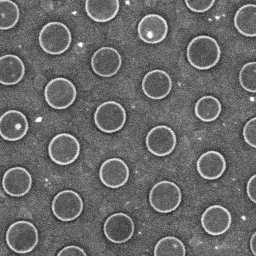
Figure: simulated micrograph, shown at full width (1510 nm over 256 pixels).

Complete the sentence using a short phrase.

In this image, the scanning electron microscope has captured a regular array of raised bodies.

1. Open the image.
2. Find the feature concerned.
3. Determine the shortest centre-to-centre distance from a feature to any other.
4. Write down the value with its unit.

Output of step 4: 326 nanometers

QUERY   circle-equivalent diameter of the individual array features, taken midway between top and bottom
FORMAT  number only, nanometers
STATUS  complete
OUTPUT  172